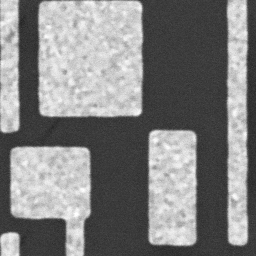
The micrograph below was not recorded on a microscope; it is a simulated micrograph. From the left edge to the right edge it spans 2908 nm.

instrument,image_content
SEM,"wiring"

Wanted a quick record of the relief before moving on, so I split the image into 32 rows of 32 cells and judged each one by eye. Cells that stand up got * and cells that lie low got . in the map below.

**...************............**.
**...*************...........**.
**...*************...........**.
**...*************...........**.
**...*************...........**.
**...*************...........**.
**...*************...........**.
**...*************...........**.
**...*************...........**.
**...*************...........**.
**...*************...........**.
**...*************...........**.
**...*************...........**.
**...*************...........**.
**...........................**.
**...........................**.
...................*****.....**.
...................*****.....**.
..******...........*****.....**.
.**********........*****.....**.
.**********........*****.....**.
.**********........*****.....**.
.**********........*****.....**.
.**********........*****.....**.
.**********........*****.....**.
.**********........*****.....**.
..*********........*****.....**.
........***........*****.....**.
........**.........*****.....**.
**......**.........*****.....**.
**......**.........*****.....*..
**......**......................